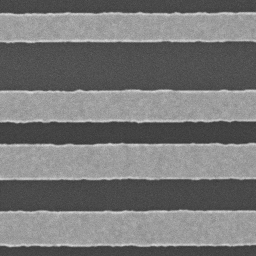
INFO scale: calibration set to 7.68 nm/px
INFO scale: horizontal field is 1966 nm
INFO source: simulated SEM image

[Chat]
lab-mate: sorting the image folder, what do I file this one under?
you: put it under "lines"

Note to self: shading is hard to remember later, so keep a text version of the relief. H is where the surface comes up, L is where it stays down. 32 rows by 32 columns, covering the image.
LLLLLLLLLLLLLLLLLLLLLLLLLLLLLLLL
LLLLLLLLLLLLLLLLLLLLLLLLLLLLLLLL
HHHHHHHHHHHHHHHHHHHHHHHHHHHHHHHH
HHHHHHHHHHHHHHHHHHHHHHHHHHHHHHHH
HHHHHHHHHHHHHHHHHHHHHHHHHHHHHHHH
LLLLLLLLLLLLLLLLLLLLLLLLLLLLLLLL
LLLLLLLLLLLLLLLLLLLLLLLLLLLLLLLL
LLLLLLLLLLLLLLLLLLLLLLLLLLLLLLLL
LLLLLLLLLLLLLLLLLLLLLLLLLLLLLLLL
LLLLLLLLLLLLLLLLLLLLLLLLLLLLLLLL
LLLLLLLLLLLLLLLLLLLLLLLLLLLLLLLL
HHHHHHHHLHHHHHHHHHHHHHHHHHHHHHHH
HHHHHHHHHHHHHHHHHHHHHHHHHHHHHHHH
HHHHHHHHHHHHHHHHHHHHHHHHHHHHHHHH
HHHHHHHHHHHHHHHHHHHHHHHHHHHHHHHH
LLLLLLLLLLLLLLLLLLLLLLLLLLLLLLLL
LLLLLLLLLLLLLLLLLLLLLLLLLLLLLLLL
LLLLLLLLLLLLLLLLLLLLLLLLLLLLLLLL
HHHHHHHHHHHHHHHHHHHHHHHHHHHHHHHH
HHHHHHHHHHHHHHHHHHHHHHHHHHHHHHHH
HHHHHHHHHHHHHHHHHHHHHHHHHHHHHHHH
HHHHHHHHHHHHHHHHHHHHHHHHHHHHHHHH
LLLLLLLLLLLLLLLLLLLLLLLLLLLLLLLL
LLLLLLLLLLLLLLLLLLLLLLLLLLLLLLLL
LLLLLLLLLLLLLLLLLLLLLLLLLLLLLLLL
LLLLLLLLLLLLLLLLLLLLLLLLLLLLLLLL
HHHHHHHHHHHHHHHHHHHHHHHHHHHHHHHH
HHHHHHHHHHHHHHHHHHHHHHHHHHHHHHHH
HHHHHHHHHHHHHHHHHHHHHHHHHHHHHHHH
HHHHHHHHHHHHHHHHHHHHHHHHHHHHHHHH
HHHHHHHHHHHHHHHHHHHHHHHHHHHHHHHH
LLLLLLLLLLLLLLLLLLLLLLLLLLLLLLLL